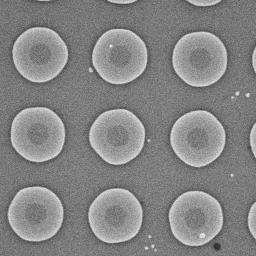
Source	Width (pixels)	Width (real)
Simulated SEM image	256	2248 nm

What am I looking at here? an array of small figures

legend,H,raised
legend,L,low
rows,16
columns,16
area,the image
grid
LLLLLLLLLLLLLLLL
LLLLLLLLLLLLLLLL
LHHHLLHHHLLHHHLL
LHHHLLHHHLLHHHLL
LHHHLLHHHLLHHHLL
LLLLLLLLLLLLLLLL
LLLLLLLLLLLLLLLL
LHHHLLHHHLLHHHLL
LHHHLLHHHLLHHHLL
LHHHLLHHHLLHHHLL
LLLLLLLLLLLLLLLL
LLLLLLLLLLLLLLLL
LHHHLLHHHLLHHLLL
LHHHLLHHHLLHHHLL
LHHLLLHHHLLHHHLL
LLLLLLLLLLLLLLLL